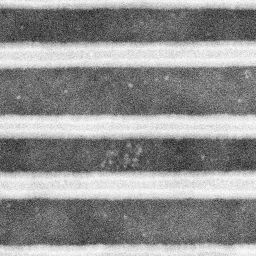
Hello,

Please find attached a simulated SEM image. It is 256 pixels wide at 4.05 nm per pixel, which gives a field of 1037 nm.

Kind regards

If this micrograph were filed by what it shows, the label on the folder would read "lines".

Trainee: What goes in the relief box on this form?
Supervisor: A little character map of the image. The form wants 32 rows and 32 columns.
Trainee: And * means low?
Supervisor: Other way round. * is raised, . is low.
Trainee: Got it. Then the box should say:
********************************
................................
................................
................................
................................
...........................***..
********************************
********************************
................................
................................
................................
................................
................................
................................
................................
********************************
********************************
................................
................................
................................
................................
................................
********************************
********************************
................................
................................
................................
................................
................................
................................
................................
********************************